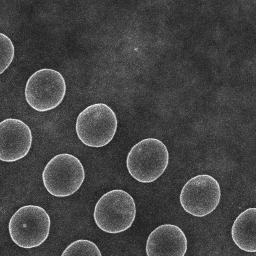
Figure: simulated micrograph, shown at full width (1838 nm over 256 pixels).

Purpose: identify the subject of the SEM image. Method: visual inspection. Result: raised bodies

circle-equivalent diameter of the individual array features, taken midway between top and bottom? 297 nanometres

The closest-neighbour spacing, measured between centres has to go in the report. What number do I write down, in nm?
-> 436